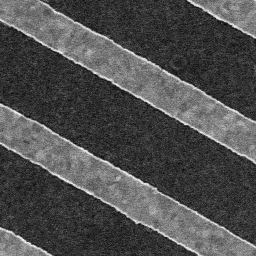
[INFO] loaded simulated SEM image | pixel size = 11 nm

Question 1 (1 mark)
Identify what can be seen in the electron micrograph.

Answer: one or a few lines or trenches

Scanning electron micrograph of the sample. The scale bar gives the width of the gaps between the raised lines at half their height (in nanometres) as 799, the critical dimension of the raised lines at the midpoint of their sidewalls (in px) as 35.1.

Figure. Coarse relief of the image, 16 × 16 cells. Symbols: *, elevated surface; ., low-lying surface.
***..........***
.****.........**
..*****.........
....*****.......
......****......
........****....
.........*****..
**.........*****
****.........***
.****..........*
...****.........
.....****.......
......*****.....
........*****...
*.........****..
**..........****